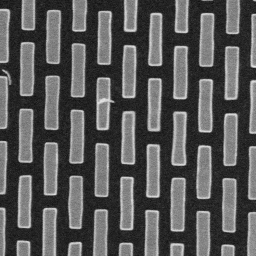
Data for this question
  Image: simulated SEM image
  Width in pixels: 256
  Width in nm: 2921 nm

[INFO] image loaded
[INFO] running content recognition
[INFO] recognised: groups of lines, slits or small figures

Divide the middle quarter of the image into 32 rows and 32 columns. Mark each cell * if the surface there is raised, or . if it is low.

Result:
..***..........***..........***.
..***..........***..........***.
..***..........***..........***.
..***..........***..........***.
..***...***....***...***....***.
..***...***....***...***....***.
..***...***....***...***....**..
..***...***....***...***....**..
........***..........***........
........****.........***........
........***..........***........
........***..........***........
..***...***....**....***....**..
..***...***....**....***....**..
..***...***....**....**.....**..
..***...***....**....***....**..
..***..........**.....*.....**..
..***..........**...........**..
..***..........**...........**..
..***..........**...........**..
..***...***....**....**.....**..
..***...***....***...***...***..
.****...***....***...**....***..
.****...***...****...**....***..
.****...***...****...***...***..
........***..........***........
........***..........***........
........***..........***........
.***....***...***....***........
.***....***...***....**....***..
.***....***...***....***...***..
.***....***...***....***...***..